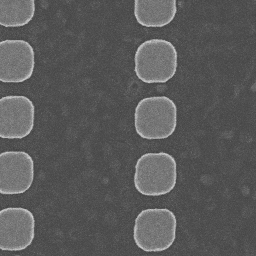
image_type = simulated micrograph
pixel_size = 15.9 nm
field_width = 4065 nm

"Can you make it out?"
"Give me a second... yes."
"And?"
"raised bodies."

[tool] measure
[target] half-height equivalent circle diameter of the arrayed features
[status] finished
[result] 676 nm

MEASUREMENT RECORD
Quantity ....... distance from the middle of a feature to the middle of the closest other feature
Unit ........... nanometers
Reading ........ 883